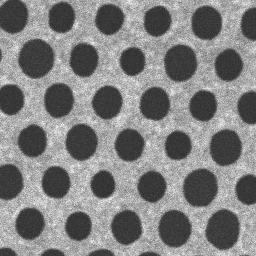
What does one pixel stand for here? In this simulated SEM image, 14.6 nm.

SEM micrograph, a regular array of holes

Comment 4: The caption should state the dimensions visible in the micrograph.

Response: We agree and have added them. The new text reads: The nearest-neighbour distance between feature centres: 0.695 micrometres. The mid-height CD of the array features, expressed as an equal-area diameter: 472 nanometres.